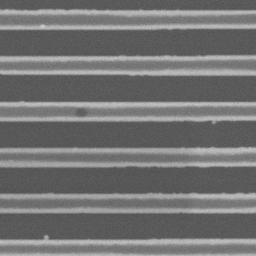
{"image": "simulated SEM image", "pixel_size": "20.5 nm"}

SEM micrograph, lines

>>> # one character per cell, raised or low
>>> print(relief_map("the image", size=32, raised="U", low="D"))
DDDDDDDDDDDDDDDDDDDDDDDDDDDDDDDD
UUUUUUUUUUUUUUUUUUUUUUUUUUUUUUUU
UUUUUUUUUUUUUUUUUUUUUUUUUUUUUUUU
UUUUUUUUUUUUUUUUUUUUUUUUDDDDDDDD
DDDDDDDDDDDDDDDDDDDDDDDDDDDDDDDD
DDDDDDDDDDDDDDDDDDDDDDDDDDDDDDDD
DDDDDDDDDDDDDDDDDDDDDDDDDDDDDDDD
UUUUUUUUUUUUUUUUUUUUUUUUUUUUUUUU
UUUUUUUUUUUUUUUUUUUUUUUUUUUUUUUU
DDDDDDDDDDDDDDDDDDDDDDDDDDDDDDDD
DDDDDDDDDDDDDDDDDDDDDDDDDDDDDDDD
DDDDDDDDDDDDDDDDDDDDDDDDDDDDDDDD
DDDDDDDDDDDDDDDDDDDDDDDDDDDDDDDD
UUUUUUUUUUUUUUUUUUUUUUUUUUUUUUUU
UUUUUUUUUUUUUUUUUUUUUUUUUUUUUUUU
DDDDDDDDDDDDDDDDDDDDDDDDDDDDDDDD
DDDDDDDDDDDDDDDDDDDDDDDDDDDDDDDD
DDDDDDDDDDDDDDDDDDDDDDDDDDDDDDDD
DDDDDDDDDDDDDDDDDDDDDDDDDDDDDDDD
UUUUUUUUUUUUUUUUUUUUUUUUUUUUUUUU
UUUUUUUUUUUUUUUUUUUUUUUUUUUUUUUU
DDDDDDDDDDDDDDDDDDDDDDDDDDDDDDDD
DDDDDDDDDDDDDDDDDDDDDDDDDDDDDDDD
DDDDDDDDDDDDDDDDDDDDDDDDDDDDDDDD
UUUUUUUUUUUUUUUUUUUUUUUUUUUUUUUU
UUUUUUUUUUUUUUUUUUUUUUUUUUUUUUUU
DDDDDDDDDDDDDDDDDDDDDDDDDDDDDDDD
DDDDDDDDDDDDDDDDDDDDDDDDDDDDDDDD
DDDDDDDDDDDDDDDDDDDDDDDDDDDDDDDD
DDDDDDDDDDDDDDDDDDDDDDDDDDDDDDDD
UUUUUUUUUUUUUUUUUUUUUUUUUUUUUUUU
UUUUUUUUUUUUUUUUUUUUUUUUUUUUUUUU